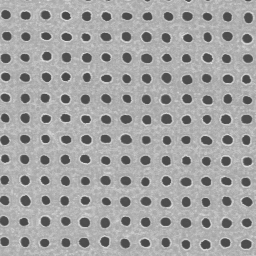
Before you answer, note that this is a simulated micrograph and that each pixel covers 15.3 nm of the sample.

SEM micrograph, a regular array of holes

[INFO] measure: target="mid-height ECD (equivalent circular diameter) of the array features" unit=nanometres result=147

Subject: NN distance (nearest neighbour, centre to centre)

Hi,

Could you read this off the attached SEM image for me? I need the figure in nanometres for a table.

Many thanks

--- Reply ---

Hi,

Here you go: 299